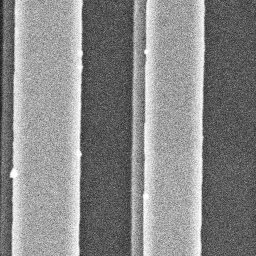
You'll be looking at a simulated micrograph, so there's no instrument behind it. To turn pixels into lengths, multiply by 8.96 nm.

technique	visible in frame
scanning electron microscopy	lines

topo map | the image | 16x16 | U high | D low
DUUUUDDDDUUUUDDD
DUUUUDDDDUUUUDDD
DUUUUDDDDUUUUDDD
DUUUUDDDDUUUUDDD
DUUUUDDDDUUUUDDD
DUUUUDDDDUUUUDDD
DUUUUDDDDUUUUDDD
DUUUUDDDDUUUUDDD
DUUUUDDDDUUUUDDD
DUUUUDDDDUUUUDDD
DUUUUDDDDUUUUDDD
DUUUUDDDDUUUUDDD
DUUUUDDDDUUUUDDD
DUUUUDDDDUUUUDDD
DUUUUDDDDUUUUDDD
DUUUUDDDDUUUUDDD